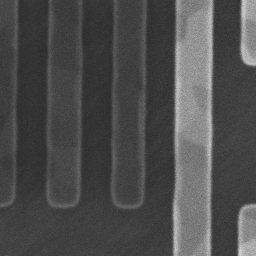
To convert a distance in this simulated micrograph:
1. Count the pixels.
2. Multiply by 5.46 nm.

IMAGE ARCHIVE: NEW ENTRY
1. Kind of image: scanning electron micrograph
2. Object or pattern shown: wiring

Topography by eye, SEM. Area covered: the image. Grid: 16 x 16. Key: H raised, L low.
HLLHHLLHHLLHHLLH
HLLHHLLHHLLHHLLH
HLLHHLLHHLLHHLLH
HLLHHLLHHLLHHLLH
HLLHHLLHHLLHHLLL
HLLHHLLHHLLHHLLL
HLLHHLLHHLLHHLLL
HLLHHLLHHLLHHLLL
HLLHHLLHHLLHHLLL
HLLHHLLHHLLHHLLL
HLLHHLLHHLLHHLLL
HLLHHLLHHLLHHLLL
HLLHHLLHHLLHHLLL
LLLLLLLLLLLHHLLH
LLLLLLLLLLLHHLLH
LLLLLLLLLLLHHLLH